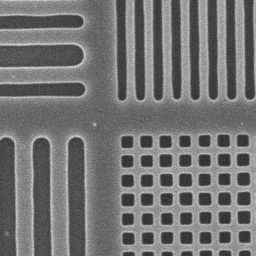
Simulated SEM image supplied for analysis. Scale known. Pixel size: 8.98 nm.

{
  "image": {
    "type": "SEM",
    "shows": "groups of lines, slits or small figures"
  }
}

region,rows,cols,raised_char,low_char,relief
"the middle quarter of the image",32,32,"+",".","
...++++++++++...+...++...++..++.
+++++++++++++...+...++...++..++.
+++++++++++++...++..++...++..++.
+++++++++++++...++..++...++..++.
....+++++++++...++..++...++..++.
.....++++++++...++..++...++..++.
.....++++++++...++..++...++..++.
.....++++++++...++..++...++..++.
++++++++++++++..++..+++..++..+++
++++++++++++++++++++++++++++++++
++++++++++++++++++++++++++++++++
++++++++++++++++++++++++++++++++
++++++++++++++++++++++++++++++++
++++++++++++++++++++++++++++++++
++++++++++++++++++++++++++++++++
++++++++++++++++++++++++++++++++
++++++++++++++++++++++++++++++++
++++++++++++++++++++++++++++++++
++..++++++++++...++...++...++...
+....+++++++++...++...++...++...
+....+++++++++...++...++...++..+
+....+++++++++++++++++++++++++++
+....+++++++++++++++++++..++++++
+....+++++++++...++...++...++...
+....+++++++++...++...++...++...
+....+++++++++...++...++...++...
+....+++++++++++++++++++++++++++
+....++++++++++++++++.++...++..+
+....+++++++++...++...++...++...
+....+++++++++....+...++...++...
+....+++++++++...++...++...++...
+....+++++++++++++++++++++++++++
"